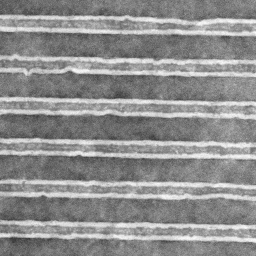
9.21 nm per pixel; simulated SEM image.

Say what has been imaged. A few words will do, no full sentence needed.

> parallel lines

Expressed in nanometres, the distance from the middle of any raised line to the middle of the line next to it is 379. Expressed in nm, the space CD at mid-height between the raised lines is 268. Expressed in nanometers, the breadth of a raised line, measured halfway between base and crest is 116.